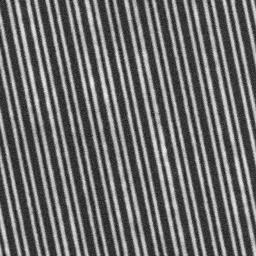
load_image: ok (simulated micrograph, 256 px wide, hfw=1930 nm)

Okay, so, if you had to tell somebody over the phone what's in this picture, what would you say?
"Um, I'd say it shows parallel lines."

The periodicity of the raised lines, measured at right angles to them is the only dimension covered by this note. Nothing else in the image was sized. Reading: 72.6 nm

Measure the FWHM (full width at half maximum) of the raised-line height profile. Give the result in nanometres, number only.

20.3